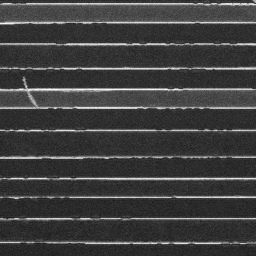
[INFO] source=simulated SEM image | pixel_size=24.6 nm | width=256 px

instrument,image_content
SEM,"lines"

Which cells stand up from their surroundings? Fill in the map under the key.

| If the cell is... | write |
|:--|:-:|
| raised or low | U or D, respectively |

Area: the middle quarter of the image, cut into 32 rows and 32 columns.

UUUUUUUUUUUUUUUUUUUUUUUUUUUUUUUU
DDDDDDDDDDDDDDDDDDDDDDDDDDDDDDDD
DDDDDDDDDDDDDDDDDDDDDDDDDDDDDDDD
DDDDDDDDDDDDDDDDDDDDDDDDDDDDDDDD
DDDDDDDDDDDDDDDDDDDDDDDDDDDDDDDD
DDDDDDDDDDDDDDDDDDDDDDDDDDDDDDDD
UUUUUUUUUUUUUUUUUUUUUUUUUUUUUUUU
UUUUUUUUUUUUUUUUUUUUUUUUUUUUUUUU
UUUUUUUUUUUUUUUUUUUUUUUUUUUUUUUU
UUUUUUUUUUUUUUUUUUUUUUUUUUUUUUUU
UUUUUUUUUUUUUUUUUUUUUUUUUUUUUUUU
DDDDDDDDDDDDDDDDDDDDDDDDDDDDDDDD
DDDDDDDDDDDDDDDDDDDDDDDDDDDDDDDD
DDDDDDDDDDDDDDDDDDDDDDDDDDDDDDDD
DDDDDDDDDDDDDDDDDDDDDDDDDDDDDDDD
DDDDDDDDDDDDDDDDDDDDDDDDDDDDDDDD
DDDDDDDDDDDDDDDDDDDDDDDDDDDDDDDD
UUUUUUUUUUUUUUUUUUUUUUUUUUUUUUUU
UUUUUUUUUUUUUUUUUUUUUUUUUUUUUUUU
UUUUUUUUUUUUUUUUUUUUUUUUUUUUUUUU
UUUUUUUUUUUUUUUUUUUUUUUUUUUUUUUU
UUUUUUUUUUUUUUUUUUUUUUUUUUUUUUUU
UUUUUUUUUUUUUUUUUUUUUUUUUUUUUUUU
DDDDDDDDDDDDDDDDDDDDDDDDDDDDDDDD
DDDDDDDDDDDDDDDDDDDDDDDDDDDDDDDD
DDDDDDDDDDDDDDDDDDDDDDDDDDDDDDDD
DDDDDDDDDDDDDDDDDDDDDDDDDDDDDDDD
DDDDDDDDDDDDDDDDDDDDDDDDDDDDDDDD
DDDDDDDDDDDDDDDDDDDDDDDDDDDDDDDD
UUUUUUUUUUUUUUUUUUUUUUUUUUUUUUUU
UUUUUUUUUUUUUUUUUUUUUUUUUUUUUUUU
UUUUUUUUUUUUUUUUUUUUUUUUUUUUUUUU